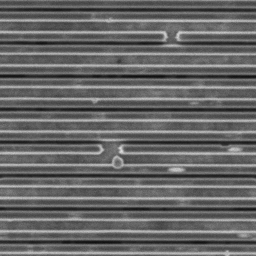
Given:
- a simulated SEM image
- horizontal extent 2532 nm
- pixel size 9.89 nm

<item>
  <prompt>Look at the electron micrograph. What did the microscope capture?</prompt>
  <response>parallel lines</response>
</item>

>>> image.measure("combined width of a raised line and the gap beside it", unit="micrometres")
0.164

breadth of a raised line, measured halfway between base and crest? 86.6 nm